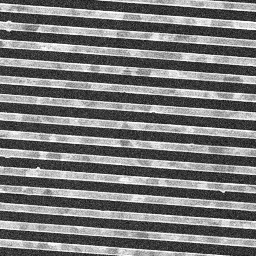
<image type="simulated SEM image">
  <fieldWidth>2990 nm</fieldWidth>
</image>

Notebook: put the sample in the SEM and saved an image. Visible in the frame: parallel lines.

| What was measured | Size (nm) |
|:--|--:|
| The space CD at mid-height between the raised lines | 133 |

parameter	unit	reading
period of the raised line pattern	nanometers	211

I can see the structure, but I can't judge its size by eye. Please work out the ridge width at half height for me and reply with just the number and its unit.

74.2 nanometers